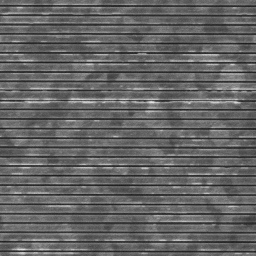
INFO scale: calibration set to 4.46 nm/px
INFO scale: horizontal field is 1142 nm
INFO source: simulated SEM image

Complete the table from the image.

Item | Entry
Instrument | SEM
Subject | parallel lines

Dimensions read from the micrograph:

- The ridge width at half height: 34 nanometers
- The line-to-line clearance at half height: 1.88 px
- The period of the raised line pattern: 42.1 nm